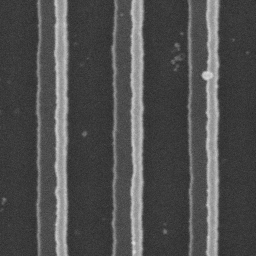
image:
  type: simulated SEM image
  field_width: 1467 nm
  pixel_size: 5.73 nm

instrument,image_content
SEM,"lines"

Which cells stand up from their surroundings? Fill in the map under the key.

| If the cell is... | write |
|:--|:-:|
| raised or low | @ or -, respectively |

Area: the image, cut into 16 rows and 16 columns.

--@@---@@---@@--
--@@---@@---@@--
--@@---@@---@@--
--@@---@@---@@--
--@@---@@---@@--
--@@---@@---@@--
--@@---@@---@@--
--@@---@@---@@--
--@@---@@---@@--
--@@---@@---@@--
--@@---@@---@@--
--@@---@@---@@--
--@@---@@---@@--
--@@---@@---@@--
--@@---@@---@@--
--@@---@@---@@--